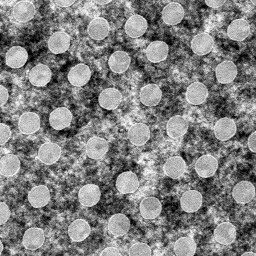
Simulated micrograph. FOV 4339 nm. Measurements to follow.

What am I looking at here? a regular array of raised bodies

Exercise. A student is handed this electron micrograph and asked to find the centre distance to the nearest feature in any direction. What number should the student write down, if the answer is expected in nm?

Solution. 636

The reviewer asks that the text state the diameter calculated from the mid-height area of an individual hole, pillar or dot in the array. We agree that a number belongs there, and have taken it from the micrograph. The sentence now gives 372 nm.